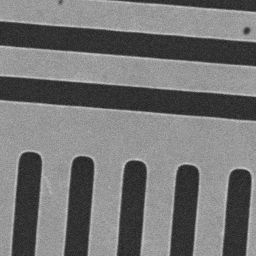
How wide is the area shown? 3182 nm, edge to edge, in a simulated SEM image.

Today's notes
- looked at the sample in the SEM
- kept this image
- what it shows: groups of lines, slits or small figures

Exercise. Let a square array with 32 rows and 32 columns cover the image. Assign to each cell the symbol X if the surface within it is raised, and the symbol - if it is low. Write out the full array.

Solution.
XXXXXXXXXXXXXXXXXXXX------------
XXXXXXXXXXXXXXXXXXXXXXXXXXXXXXXX
XXXXXXXXXXXXXXXXXXXXXXXXXXXXXXXX
------------XXXXXXXXXXXXXXXXXXXX
-----------------------XXXXXXXXX
--------------------------------
XXXXXXXXXX----------------------
XXXXXXXXXXXXXXXXXXXXXX----------
XXXXXXXXXXXXXXXXXXXXXXXXXXXXXXXX
-XXXXXXXXXXXXXXXXXXXXXXXXXXXXXXX
-------------XXXXXXXXXXXXXXXXXXX
--------------------------XXXXXX
--------------------------------
XXXXXXXXXXXX--------------------
XXXXXXXXXXXXXXXXXXXXXXXX--------
XXXXXXXXXXXXXXXXXXXXXXXXXXXXXXXX
XXXXXXXXXXXXXXXXXXXXXXXXXXXXXXXX
XXXXXXXXXXXXXXXXXXXXXXXXXXXXXXXX
XXXXXXXXXXXXXXXXXXXXXXXXXXXXXXXX
XXX--XXXXXXXXXXXXXXXXXXXXXXXXXXX
XX---XXXX---XXXX--XXXXXXXXXXXXXX
XX---XXXX---XXX---XXXX---XXXX--X
XX---XXXX---XXX---XXXX---XXXX--X
XX---XXXX---XXX---XXXX---XXX---X
XX---XXXX---XXX---XXXX---XXX---X
XX---XXX----XXX---XXXX---XXX---X
XX---XXX---XXXX---XXXX---XXX---X
XX---XXX---XXXX---XXXX--XXXX---X
XX---XXX---XXXX---XXX---XXXX---X
XX---XXX---XXXX---XXX---XXXX---X
X----XXX---XXXX---XXX---XXXX---X
X---XXXX---XXXX---XXX---XXXX---X